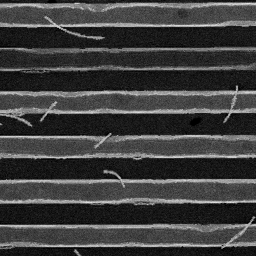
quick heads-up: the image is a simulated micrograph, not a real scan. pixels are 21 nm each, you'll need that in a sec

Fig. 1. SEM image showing lines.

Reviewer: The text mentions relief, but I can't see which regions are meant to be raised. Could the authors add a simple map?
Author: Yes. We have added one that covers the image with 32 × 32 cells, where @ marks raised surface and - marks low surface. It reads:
--------------------------------
@@@@@@@@@@@@@@@@@@@@@@@@@@@@@@@@
@@@@@@@@@@@@@@@@@@@@@@@@@@@@@@@@
--------------------------------
--------------------------------
--------------------------------
@@@@@@@@@@@@@@@@@@@@@@@@@@@@@@@@
@@@@@@@@@@@@@@@@@@@@@@@@@@@@@@@@
@@@@@@@@@@@@---@@@@-@@@@@@------
--------------------------------
--------------------------------
-----------------------------@--
@@@@@@@@@@@@@@@@@@@@@@@@@@@@@@@@
@@@@@@@@@@@@@@@@@@@@@@@@@@@@@@@@
--------------------------------
--------------------------------
--------------------------------
@@@@@@@@@@@@@@@@@@@@@@@@@@@@@@@@
@@@@@@@@@@@@@@@@@@@@@@@@@@@@@@@@
----@@@@@@@--------@@@@-----@@--
--------------------------------
--------------------------------
--------------@-----------------
@@@@@@@@@@@@@@@@@@@@@@@@@@@@@@@@
@@@@@@@@@@@@@@@@@@@@@@@@@@@@@@@@
--------------------------------
--------------------------------
--------------------------------
@@@@@@@@@@@@@@@@@@@@@@@@@--@@@@@
@@@@@@@@@@@@@@@@@@@@@@@@@@@@@@@@
@@-@@@@@@@@@@@@@@@@@@@@@@@@@@@--
--------------------------------